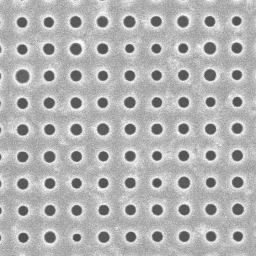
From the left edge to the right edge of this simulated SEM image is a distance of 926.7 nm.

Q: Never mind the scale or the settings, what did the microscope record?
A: a regular array of holes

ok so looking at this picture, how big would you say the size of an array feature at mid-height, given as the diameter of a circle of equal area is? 39.4 nanometres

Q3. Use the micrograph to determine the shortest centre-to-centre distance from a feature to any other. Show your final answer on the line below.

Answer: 0.0966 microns